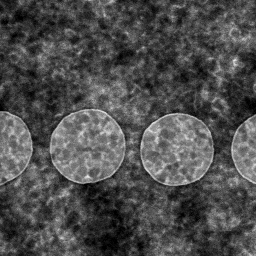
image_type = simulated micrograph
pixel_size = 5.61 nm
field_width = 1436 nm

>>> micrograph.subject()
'raised bodies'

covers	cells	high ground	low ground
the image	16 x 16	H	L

LLLLLLLLLLLLLLLL
LLLLLLLLLLLLLLLL
LLLLLLLLLLLLLLLL
LLLLLLLLLLLLLLLL
LLLLLLLLLLLLLLLL
LLLLLLLLLLLLLLLL
LLLLLLLLLLLLLLLL
HLLLHHHLLLHHLLLH
HHLHHHHHLHHHHLLH
HHLHHHHHLHHHHLLH
HHLLHHHLLHHHHLLH
LLLLLLLLLLHHLLLL
LLLLLLLLLLLLLLLL
LLLLLLLLLLLLLLLL
LLLLLLLLLLLLLLLL
LLLLLLLLLLLLLLLL